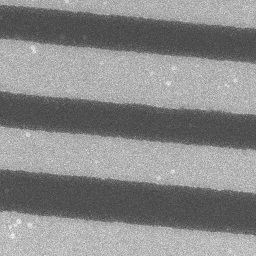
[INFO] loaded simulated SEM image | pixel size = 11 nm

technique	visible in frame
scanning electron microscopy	one or a few lines or trenches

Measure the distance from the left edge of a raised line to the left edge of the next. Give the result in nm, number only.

924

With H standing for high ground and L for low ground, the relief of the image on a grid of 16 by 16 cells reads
HHHLLLLLLLLLLLLL
HHHHHHHHHHHHHLLL
HHHHHHHHHHHHHHHH
LLLLLLLLLLHHHHHH
LLLLLLLLLLLLLLLL
LLLLLLLLLLLLLLLL
HHHHHHHHHLLLLLLL
HHHHHHHHHHHHHHHH
LLLLLLHHHHHHHHHH
LLLLLLLLLLLLLLLL
LLLLLLLLLLLLLLLL
HHHHHHHHHHLLLLLL
HHHHHHHHHHHHHHHH
LLHHHHHHHHHHHHHH
LLLLLLLLLLLLLHHH
LLLLLLLLLLLLLLLL